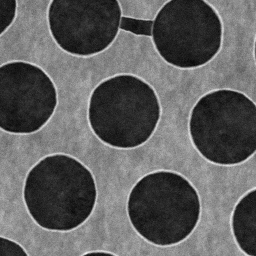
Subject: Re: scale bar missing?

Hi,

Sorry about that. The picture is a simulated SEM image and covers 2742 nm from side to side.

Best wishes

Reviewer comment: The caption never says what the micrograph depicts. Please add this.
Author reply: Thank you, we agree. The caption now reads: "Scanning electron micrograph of holes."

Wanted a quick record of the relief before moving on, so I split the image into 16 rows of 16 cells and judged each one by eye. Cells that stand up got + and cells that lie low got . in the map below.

.++....+++...+++
.++...........++
+++....++.....++
++++++++++...+++
...+++++++++++++
...+++...+++++++
...+++....++....
...+++....++....
++++++...+++....
+++++++++++++...
++...+++++++++++
++....+++...++++
++....++....+++.
++....++....+++.
+++++++++...+++.
.++++++++++++++.